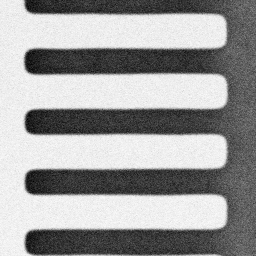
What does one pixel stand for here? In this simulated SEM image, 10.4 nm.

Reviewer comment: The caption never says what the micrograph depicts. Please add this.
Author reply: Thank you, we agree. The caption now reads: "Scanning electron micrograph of groups of lines, slits or small figures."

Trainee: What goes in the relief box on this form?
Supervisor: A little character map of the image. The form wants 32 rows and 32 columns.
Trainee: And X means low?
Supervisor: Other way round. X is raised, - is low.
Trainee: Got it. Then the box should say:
XXX-----------------------------
XXXX----------------------------
XXXXXXXXXXXXXXXXXXXXXXXXXXXX----
XXXXXXXXXXXXXXXXXXXXXXXXXXXX----
XXXXXXXXXXXXXXXXXXXXXXXXXXXX----
XXXXXXXXXXXXXXXXXXXXXXXXXXXX----
XXX-----------------------------
XXX-----------------------------
XXX-----------------------------
XXXXXXXXXXXXXXXXXXXXXXXXXXXX----
XXXXXXXXXXXXXXXXXXXXXXXXXXXX----
XXXXXXXXXXXXXXXXXXXXXXXXXXXX----
XXXXXXXXXXXXXXXXXXXXXXXXXXXX----
XXXXXX-------XXX----------------
XXX-----------------------------
XXX-----------------------------
XXX-----------------------------
XXXXXXXXXXXXXXXXXXXXXXXXXXXX----
XXXXXXXXXXXXXXXXXXXXXXXXXXXX----
XXXXXXXXXXXXXXXXXXXXXXXXXXXX----
XXXXXXXXXXXXXXXXXXXXXXXXXXXX----
XXXX----------------------------
XXX-----------------------------
XXX-----------------------------
XXXXX---XXXXXXXX-------XXXX-----
XXXXXXXXXXXXXXXXXXXXXXXXXXXX----
XXXXXXXXXXXXXXXXXXXXXXXXXXXX----
XXXXXXXXXXXXXXXXXXXXXXXXXXXX----
XXXXXXXXXXXXXXXXXXXXXXXXXXX-----
XXX-----------------------------
XXX-----------------------------
XXX-----------------------------